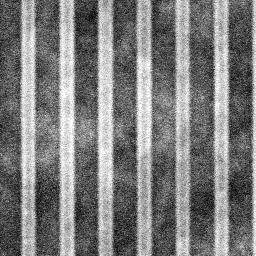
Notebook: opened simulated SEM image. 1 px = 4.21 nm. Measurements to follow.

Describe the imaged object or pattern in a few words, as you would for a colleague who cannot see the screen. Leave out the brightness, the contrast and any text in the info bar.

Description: parallel lines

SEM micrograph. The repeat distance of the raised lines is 162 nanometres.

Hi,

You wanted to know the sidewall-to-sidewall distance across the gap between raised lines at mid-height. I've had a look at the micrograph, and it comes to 115 nm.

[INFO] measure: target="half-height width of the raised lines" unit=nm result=48.4